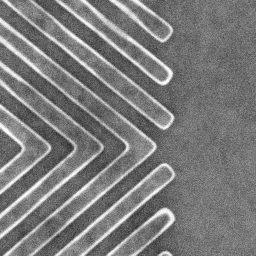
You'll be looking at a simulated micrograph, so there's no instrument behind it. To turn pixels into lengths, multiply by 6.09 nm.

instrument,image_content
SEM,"groups of lines, slits or small figures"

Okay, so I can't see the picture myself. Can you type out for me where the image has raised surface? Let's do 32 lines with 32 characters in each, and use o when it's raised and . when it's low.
.oooo...ooo....ooo..............
..oooo...ooo....ooo.............
...oooo...ooo....ooo............
o....ooo...ooo....ooo...........
ooo...ooo....ooo...oo...........
.ooo...ooo....ooo...............
..ooo...oooo...ooo..............
...ooo....ooo...oooo............
o...oooo...ooo....ooo...........
oo...oooo...oooo...oo...........
ooo....ooo...oooo...............
.oooo...ooo...oooo..............
..oooo...oooo...ooo.............
....ooo...oooo...ooo............
oo...ooo...oooo...ooo...........
ooo...oooo...oooo...o...........
.ooo...oooo...oooo..............
..oooo...ooo...oooo.............
...ooo...oooo...ooo.............
..oooo...ooo...ooo..............
.ooo...oooo...ooo...............
ooo...oooo...ooo...ooo..........
oo...ooo....ooo...ooo...........
o...ooo...oooo...ooo............
...ooo...ooo....ooo.............
..ooo...ooo...oooo..............
.ooo...ooo...oooo...o...........
ooo...ooo...ooo....oo...........
o....ooo...ooo...oooo...........
...oooo...ooo...oooo............
..oooo...ooo...oooo.............
.ooo...oooo...ooo...............